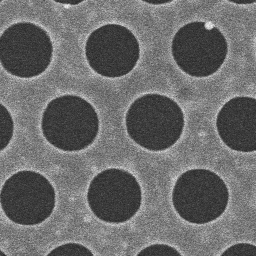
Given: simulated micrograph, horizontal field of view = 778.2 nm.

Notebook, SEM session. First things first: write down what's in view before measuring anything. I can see holes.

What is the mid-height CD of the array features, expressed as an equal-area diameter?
168 nm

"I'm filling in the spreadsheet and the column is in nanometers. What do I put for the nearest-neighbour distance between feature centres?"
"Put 255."